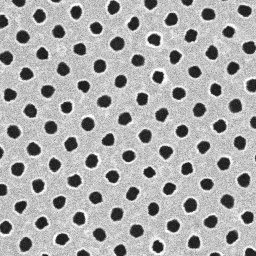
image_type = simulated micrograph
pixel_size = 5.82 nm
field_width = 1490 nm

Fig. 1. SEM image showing a regular array of holes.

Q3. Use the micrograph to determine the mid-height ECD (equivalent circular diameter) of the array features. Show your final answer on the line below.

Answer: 0.0746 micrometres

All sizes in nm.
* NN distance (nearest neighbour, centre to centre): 150